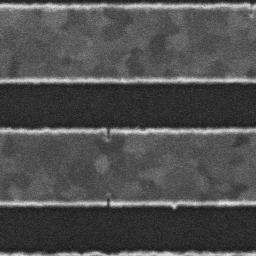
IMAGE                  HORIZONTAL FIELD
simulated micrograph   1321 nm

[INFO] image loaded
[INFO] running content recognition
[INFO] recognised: one or a few lines or trenches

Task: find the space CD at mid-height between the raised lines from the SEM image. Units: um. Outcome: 0.263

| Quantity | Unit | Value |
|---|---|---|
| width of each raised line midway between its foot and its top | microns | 0.377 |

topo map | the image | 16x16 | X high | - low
XXXXXXXXXXXXXXXX
XXXXXXXXXXXXXXXX
XXXXXXXXXXXXXXXX
XXXXXXXXXXXXXXXX
XXXXXXXXXXXXXXXX
----------------
----------------
----------------
XXXXXXXXXXXXXXXX
XXXXXXXXXXXXXXXX
XXXXXXXXXXXXXXXX
XXXXXXXXXXXXXXXX
XXXXXXXXXXXXXXXX
----------------
----------------
----------------